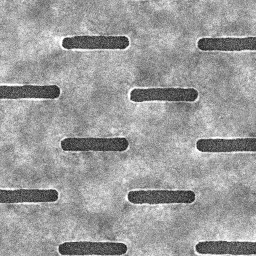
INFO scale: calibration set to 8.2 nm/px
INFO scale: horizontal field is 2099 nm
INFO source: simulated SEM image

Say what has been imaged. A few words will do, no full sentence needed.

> holes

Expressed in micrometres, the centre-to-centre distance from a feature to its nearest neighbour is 0.689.